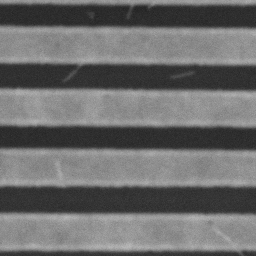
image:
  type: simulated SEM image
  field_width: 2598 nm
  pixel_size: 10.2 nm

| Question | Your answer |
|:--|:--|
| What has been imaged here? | lines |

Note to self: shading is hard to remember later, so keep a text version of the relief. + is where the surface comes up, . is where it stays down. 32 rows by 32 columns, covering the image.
...............++.++..+++++++++.
................................
................................
+++++++++++++++++++++...........
++++++++++++++++++++++++++++++++
++++++++++++++++++++++++++++++++
++++++++++++++++++++++++++++++++
++++++++++++++++++++++++++++++++
................................
................................
................................
++++++++++++++++++++++++++++++..
++++++++++++++++++++++++++++++++
++++++++++++++++++++++++++++++++
++++++++++++++++++++++++++++++++
++++++++++++++++++++++++++++++++
................................
................................
................................
++++++++++++++++++++++++++++++++
++++++++++++++++++++++++++++++++
++++++++++++++++++++++++++++++++
++++++++++++++++++++++++++++++++
................................
................................
................................
................................
++++++++++++++++++++++++++++++++
++++++++++++++++++++++++++++++++
++++++++++++++++++++++++++++++++
++++++++++++++++++++++++++++++++
................................